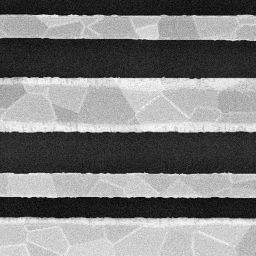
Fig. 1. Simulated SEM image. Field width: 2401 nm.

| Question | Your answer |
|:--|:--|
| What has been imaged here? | lines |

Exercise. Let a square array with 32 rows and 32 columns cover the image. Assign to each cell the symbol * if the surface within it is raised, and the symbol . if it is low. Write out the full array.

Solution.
................................
................................
********************************
********************************
********************************
................................
................................
................................
................................
................................
********************************
********************************
********************************
********************************
********************************
********************************
................................
................................
................................
................................
................................
................................
********************************
********************************
********************************
................................
................................
***********..*.***........***...
********************************
********************************
********************************
********************************